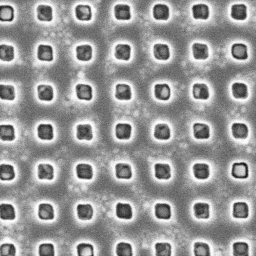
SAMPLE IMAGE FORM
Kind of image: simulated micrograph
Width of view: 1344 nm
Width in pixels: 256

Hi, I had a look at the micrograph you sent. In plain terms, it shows a regular array of holes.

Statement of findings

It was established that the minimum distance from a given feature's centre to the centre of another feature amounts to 203 nanometres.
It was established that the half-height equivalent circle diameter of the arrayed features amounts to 93.3 nanometers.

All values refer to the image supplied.